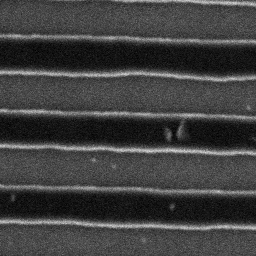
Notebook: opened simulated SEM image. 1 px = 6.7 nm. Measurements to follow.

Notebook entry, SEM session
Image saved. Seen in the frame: lines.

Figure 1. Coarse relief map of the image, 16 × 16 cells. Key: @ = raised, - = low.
----------------
----------------
@@@@@@@@@@@-----
@@@@@@@@@@@@@@@@
@@@@@@@@@@@@@@@@
----------------
----------------
@@@@@@@@@@@@@@@@
@@@@@@@@@@@@@@@@
------------@@@@
----------------
----------------
@@@@@@@@@@@@@@@@
@@@@@@@@@@@@@@@@
----------------
----------------